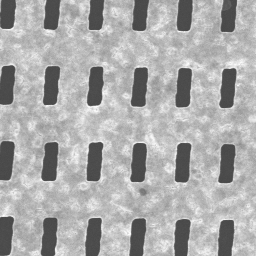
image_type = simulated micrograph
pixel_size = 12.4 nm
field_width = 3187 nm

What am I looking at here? a regular array of holes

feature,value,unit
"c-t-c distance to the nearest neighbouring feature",549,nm